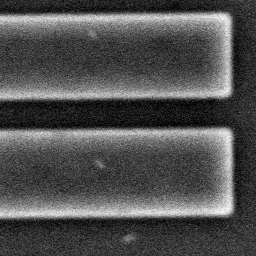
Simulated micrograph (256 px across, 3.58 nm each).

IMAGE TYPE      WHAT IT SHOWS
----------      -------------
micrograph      wiring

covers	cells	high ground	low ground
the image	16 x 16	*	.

................
**************..
**************..
**************..
**************..
**************..
................
................
**************..
**************..
**************..
**************..
**************..
................
................
................